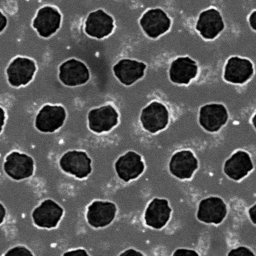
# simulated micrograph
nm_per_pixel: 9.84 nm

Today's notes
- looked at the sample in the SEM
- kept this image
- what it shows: a regular array of holes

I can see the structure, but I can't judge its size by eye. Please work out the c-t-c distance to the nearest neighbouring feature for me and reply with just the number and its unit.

0.52 micrometres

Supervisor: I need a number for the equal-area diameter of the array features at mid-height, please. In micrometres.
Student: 0.276